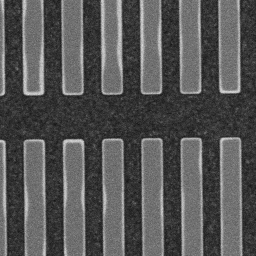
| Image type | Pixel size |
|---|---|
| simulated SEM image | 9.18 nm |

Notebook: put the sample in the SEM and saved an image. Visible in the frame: groups of lines, slits or small figures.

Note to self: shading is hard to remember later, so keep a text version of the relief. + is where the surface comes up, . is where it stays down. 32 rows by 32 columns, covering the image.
...++...++...++...++...++..+++..
...++...++...++...++...++..+++..
...++...++...++...++...++..+++..
...++...++...++...++...++..+++..
...++...++...++...++...++..+++..
+..++...++...++...++...++..+++..
...++...++...++...++...++..+++..
...++...++...++...++...++..+++..
...++...++...++...++...++..+++..
...++...++...++...++...++..+++..
...++...++...++...++...++...++..
...++...++...++...++...++...++..
................................
................................
................................
................................
................................
.............++...++...++...++..
+..++...++...++...++...++...++..
+..++...++...++...++...++...++..
+..++...++...++...++...++...++..
+..++...++...++...++...++...++..
+..++...++...++...++...++...++..
+..++...++...++...++...++...++..
+..+++..++...++...++...++...++..
+..+++..++...++...++...++...++..
+..+++..++...++...++...++...++..
+..+++..++...++...++...++...++..
+..+++..++...++...++...++...++..
+..+++..+++..++...++...++...++..
+..+++..+++..++...++...++...++..
+..+++..+++..+++..++...++...++..